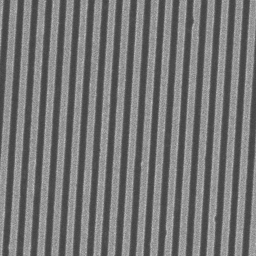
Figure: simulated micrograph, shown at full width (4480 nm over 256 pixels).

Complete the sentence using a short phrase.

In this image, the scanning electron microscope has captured parallel lines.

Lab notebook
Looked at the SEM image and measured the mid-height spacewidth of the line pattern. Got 111 nm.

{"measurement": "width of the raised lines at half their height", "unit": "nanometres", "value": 142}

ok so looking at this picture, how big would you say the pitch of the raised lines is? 246 nm